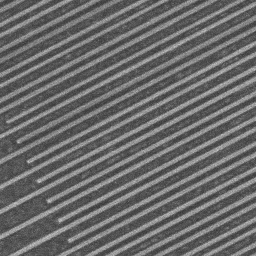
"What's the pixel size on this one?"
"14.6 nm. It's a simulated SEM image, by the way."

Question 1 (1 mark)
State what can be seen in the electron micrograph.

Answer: parallel lines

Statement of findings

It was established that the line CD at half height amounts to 42.1 nm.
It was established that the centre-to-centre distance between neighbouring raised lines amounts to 163 nm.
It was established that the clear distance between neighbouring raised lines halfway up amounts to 98.9 nanometres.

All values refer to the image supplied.